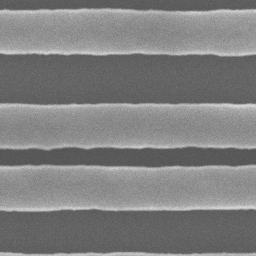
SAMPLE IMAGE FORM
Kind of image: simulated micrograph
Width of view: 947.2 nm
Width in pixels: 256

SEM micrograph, lines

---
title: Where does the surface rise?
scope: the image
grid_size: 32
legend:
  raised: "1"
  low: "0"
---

00000000000000000000000000000000
11111111111111111111111111111111
11111111111111111111111111111111
11111111111111111111111111111111
11111111111111111111111111111111
11111111111111111111111111111111
11111111111111111111111111111111
00000000000000000000000000000000
00000000000000000000000000000000
00000000000000000000000000000000
00000000000000000000000000000000
00000000000000000000000000000000
00000000000000000000000000000000
11111111111111111111111111111111
11111111111111111111111111111111
11111111111111111111111111111111
11111111111111111111111111111111
11111111111111111111111111111111
11111111001100111101111001111111
00000000000000000000000000000000
00000000000000000000000000000000
11111111111111111111111111111111
11111111111111111111111111111111
11111111111111111111111111111111
11111111111111111111111111111111
11111111111111111111111111111111
00000000000000000000000000000000
00000000000000000000000000000000
00000000000000000000000000000000
00000000000000000000000000000000
00000000000000000000000000000000
00000000000000000000000000000000